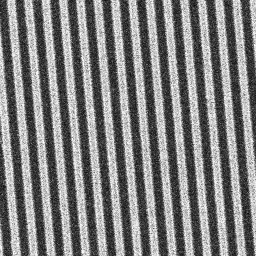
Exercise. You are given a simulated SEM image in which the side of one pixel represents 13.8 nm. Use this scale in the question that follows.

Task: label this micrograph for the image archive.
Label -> parallel lines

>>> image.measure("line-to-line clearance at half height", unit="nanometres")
134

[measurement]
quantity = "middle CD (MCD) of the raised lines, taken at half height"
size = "0.11 um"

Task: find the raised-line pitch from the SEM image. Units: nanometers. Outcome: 238